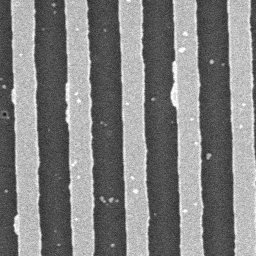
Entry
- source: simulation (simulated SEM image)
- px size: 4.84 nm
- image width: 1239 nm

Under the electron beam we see lines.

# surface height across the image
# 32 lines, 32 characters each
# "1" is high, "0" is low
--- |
01110000111000011100001110001110
01110000111000011100001110001110
00110000111000011100001110000110
00110000111000011100001110000110
00110000111000011100001110000110
00110000111000011100001110000110
00110000111000011100001110000110
00110000011000011100001110000110
00110000011000011100001110000110
00110000011000011100001110000111
00111000011000011100001110000111
00111000011000011100001110000110
00110000011000011100001110000111
00111000011000011100001110000111
00111000011000011100001110000111
00111000011000011100001110000111
00111000011000011100001110000111
00111000011000011100001110000111
00111000011000011100001110000111
00111000011100011100001110000111
00111000011100011100001110000111
00111000011000001100001110000111
00111000011100001100001110000111
00111000011100001100001110000111
00111000011100001100000110000111
00111000011100001100000110000111
00111000011100001110000110000111
00111000011100001110000110000111
00111000011100001110000110000111
00111000011100001100000110000111
00111000011100001100000110000111
00111000011100001110000110000111